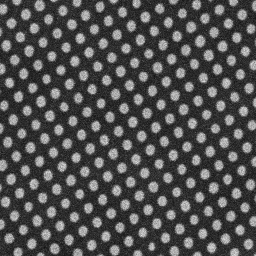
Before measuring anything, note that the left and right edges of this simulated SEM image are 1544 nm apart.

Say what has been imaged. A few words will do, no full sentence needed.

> a regular array of raised bodies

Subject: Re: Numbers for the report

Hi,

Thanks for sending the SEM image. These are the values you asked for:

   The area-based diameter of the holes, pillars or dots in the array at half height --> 56.5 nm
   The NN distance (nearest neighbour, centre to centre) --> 98.4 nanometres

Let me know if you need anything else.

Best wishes